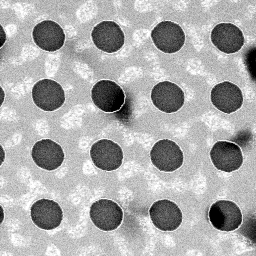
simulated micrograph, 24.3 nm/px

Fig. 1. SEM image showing a regular array of holes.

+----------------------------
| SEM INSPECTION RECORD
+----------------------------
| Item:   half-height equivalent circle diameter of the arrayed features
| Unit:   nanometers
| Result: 806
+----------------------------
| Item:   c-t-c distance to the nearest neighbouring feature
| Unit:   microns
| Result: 1.44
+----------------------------